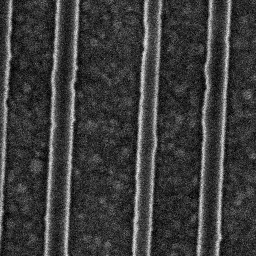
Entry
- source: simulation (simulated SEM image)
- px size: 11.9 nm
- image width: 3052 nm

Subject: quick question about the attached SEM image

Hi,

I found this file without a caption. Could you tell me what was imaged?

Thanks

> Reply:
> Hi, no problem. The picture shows one or a few lines or trenches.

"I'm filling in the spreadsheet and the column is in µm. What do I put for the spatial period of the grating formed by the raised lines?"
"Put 0.906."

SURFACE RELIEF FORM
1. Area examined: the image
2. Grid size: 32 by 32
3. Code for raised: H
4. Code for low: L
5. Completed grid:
HLLLLLLHHHLLLLLLLLHHLLLLLLHHHLLL
HLLLLLLHHHLLLLLLLLHHLLLLLLHHHLLL
HLLLLLLHHHLLLLLLLLHHLLLLLLHHHLLL
HLLLLLLHHHLLLLLLLLHHLLLLLLHHHLLL
HLLLLLLHHHLLLLLLLLHHLLLLLLHHLLLL
HLLLLLLHHLLLLLLLLLHHLLLLLLHHLLLL
HLLLLLLHHLLLLLLLLLHHLLLLLLHHLLLL
HLLLLLLHHLLLLLLLLLHHLLLLLLHHLLLL
HLLLLLLHHLLLLLLLLLHHLLLLLLHHLLLL
HLLLLLLHHLLLLLLLLLHHLLLLLLHHLLLL
HLLLLLLHHLLLLLLLLLHHLLLLLLHHLLLL
HLLLLLLHHLLLLLLLLLHHLLLLLLHHLLLL
HLLLLLLHHLLLLLLLLLHHLLLLLLHHLLLL
HLLLLLLHHLLLLLLLLLHLLLLLLLHHLLLL
HLLLLLLHHLLLLLLLLLHLLLLLLHHHLLLL
HLLLLLLHHLLLLLLLLHHLLLLLLHHHLLLL
HLLLLLLHHLLLLLLLLHHLLLLLLHHHLLLL
HLLLLLHHHLLLLLLLLHHLLLLLLLHHLLLL
HLLLLLHHHLLLLLLLLHHLLLLLLHHHLLLL
HLLLLLHHHLLLLLLLLHHLLLLLLHHHLLLL
LLLLLLHHHLLLLLLLLHHLLLLLLHHHLLLL
LLLLLLHHHLLLLLLLLHHLLLLLLHHHLLLL
LLLLLLHHHLLLLLLLLHHLLLLLLHHHLLLL
LLLLLLHHHLLLLLLLLHHLLLLLLHHHLLLL
LLLLLLHHHLLLLLLLLHHLLLLLLHHHLLLL
LLLLLLHHHLLLLLLLLHHLLLLLLHHLLLLL
LLLLLLHHLLLLLLLLLHHLLLLLLHHLLLLL
LLLLLLHHLLLLLLLLLHHLLLLLLHHLLLLL
LLLLLLHHLLLLLLLLLHHLLLLLLHHLLLLL
LLLLLLHHLLLLLLLLLHHLLLLLLHHHLLLL
LLLLLLHHLLLLLLLLLHHLLLLLLHHLLLLL
LLLLLLHHLLLLLLLLLHHLLLLLLHHLLLLL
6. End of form